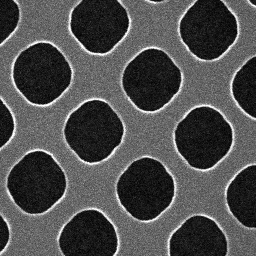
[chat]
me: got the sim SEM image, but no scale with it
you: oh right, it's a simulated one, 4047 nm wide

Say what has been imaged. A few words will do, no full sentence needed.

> holes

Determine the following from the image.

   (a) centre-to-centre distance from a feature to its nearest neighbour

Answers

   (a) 1220 nm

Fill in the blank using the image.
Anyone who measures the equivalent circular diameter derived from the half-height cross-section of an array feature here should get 0.934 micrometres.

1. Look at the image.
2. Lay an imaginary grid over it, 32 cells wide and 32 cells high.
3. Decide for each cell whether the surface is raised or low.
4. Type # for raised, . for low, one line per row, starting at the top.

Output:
..########.....#########....####
..#######.......#######......###
..#######.......#######.......##
..#######.......######........##
.########.......#######.......##
####..####.....########......###
###.....###..#####...###....####
##......########.....##########.
##.......#######......########..
##.......######........######...
##.......######........######...
###.....########......#######...
###....#########.....########...
.#########....###...####..####..
..#######......########.....###.
..######.......#######.......###
..######.......#######.......###
.#######.......#######.......###
#########.....########.......###
###...####....#########.....####
##.....#########....####...#####
#.......########.....#########..
#.......#######.......#######...
#.......#######.......######....
#.......#######.......######....
##.....########......#######....
###...####..####....#########...
.########.....###..####....###..
.#######......########.....#####
.######........######.......####
.######........######.......####
########......#######.......####